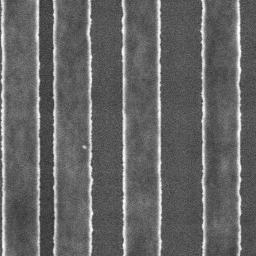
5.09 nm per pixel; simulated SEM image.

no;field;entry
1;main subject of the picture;lines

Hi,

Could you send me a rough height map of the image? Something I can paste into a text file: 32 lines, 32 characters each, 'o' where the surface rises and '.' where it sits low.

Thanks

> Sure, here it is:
ooooo..oooo....ooooo.....ooooo..
ooooo..oooo....ooooo.....ooooo..
ooooo..oooo....ooooo.....ooooo..
ooooo..oooo....ooooo.....ooooo..
ooooo..oooo....ooooo.....ooooo..
ooooo..oooo....ooooo.....ooooo..
ooooo..oooo....ooooo.....ooooo..
ooooo..oooo....ooooo.....ooooo..
ooooo..oooo....ooooo.....ooooo..
ooooo..oooo....ooooo.....ooooo..
ooooo..oooo....ooooo.....ooooo..
ooooo..oooo....ooooo.....ooooo..
ooooo..oooo....ooooo.....ooooo..
ooooo..oooo....ooooo.....ooooo..
ooooo..oooo....ooooo.....ooooo..
ooooo..oooo....ooooo.....ooooo..
ooooo..oooo....ooooo.....ooooo..
ooooo..oooo....ooooo.....ooooo..
ooooo..oooo....ooooo.....ooooo..
ooooo..oooo....ooooo.....ooooo..
ooooo..oooo....ooooo.....ooooo..
ooooo..oooo....ooooo.....ooooo..
ooooo..ooooo...ooooo.....ooooo..
ooooo..oooo....ooooo.....ooooo..
ooooo..oooo.....oooo.....ooooo..
ooooo..oooo....ooooo.....ooooo..
ooooo..ooooo...ooooo.....ooooo..
ooooo..oooo....ooooo.....ooooo..
ooooo..oooo....ooooo.....ooooo..
ooooo..oooo....ooooo.....ooooo..
ooooo..oooo....ooooo.....ooooo..
ooooo..oooo....ooooo.....ooooo..